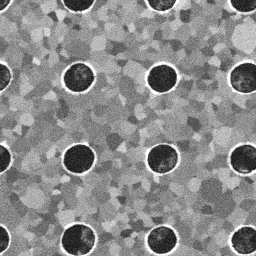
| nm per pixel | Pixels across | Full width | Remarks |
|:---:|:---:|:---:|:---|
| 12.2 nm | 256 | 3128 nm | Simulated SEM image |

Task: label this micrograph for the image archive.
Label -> holes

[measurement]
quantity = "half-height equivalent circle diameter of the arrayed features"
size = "372 nm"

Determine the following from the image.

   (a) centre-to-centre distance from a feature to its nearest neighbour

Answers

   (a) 991 nanometres